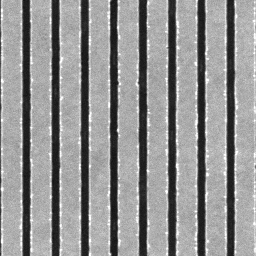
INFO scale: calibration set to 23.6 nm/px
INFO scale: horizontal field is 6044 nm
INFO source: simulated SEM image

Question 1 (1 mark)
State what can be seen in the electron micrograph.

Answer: parallel lines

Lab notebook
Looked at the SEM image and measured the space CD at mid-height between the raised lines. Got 0.186 um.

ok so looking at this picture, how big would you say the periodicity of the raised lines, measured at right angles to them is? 689 nm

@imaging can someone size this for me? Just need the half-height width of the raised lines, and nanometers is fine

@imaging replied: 484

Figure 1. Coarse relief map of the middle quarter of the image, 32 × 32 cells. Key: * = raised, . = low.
****..*****...*****..*****..****
****..*****...*****..*****..****
****..*****...*****..*****..****
****..*****...*****..*****..****
****..*****...****...*****..****
****..*****...*****..*****..****
****..*****...*****..*****..****
****..*****...*****..*****..****
****..*****...*****..*****..****
****..*****...*****..*****..****
****..*****...*****..*****..****
****..*****...*****..*****..****
****..*****...*****..*****..****
****..*****...*****..*****..****
****..*****...*****..*****..****
****..*****...*****..*****..****
****..*****..*****...*****..****
****..*****...*****..*****..****
****..*****...****...*****..****
****..*****...*****..*****..****
****..*****...*****..*****..****
****..*****...*****..*****..****
****..*****...*****..*****..****
****..*****...*****..*****..****
****..*****...*****..*****..****
****..*****...*****..*****..****
****..*****...*****..*****..****
****..*****...*****..*****..****
****..*****...*****..*****..****
****..*****...*****..*****..****
****..*****...****...*****..****
****..*****...*****..*****..****